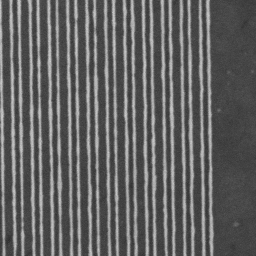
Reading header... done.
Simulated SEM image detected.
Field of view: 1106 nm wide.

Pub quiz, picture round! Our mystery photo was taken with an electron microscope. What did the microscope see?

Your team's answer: parallel lines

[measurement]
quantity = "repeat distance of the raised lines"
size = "40.6 nanometers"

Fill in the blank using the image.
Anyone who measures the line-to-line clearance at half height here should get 29.7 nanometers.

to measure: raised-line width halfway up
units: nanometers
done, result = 11.3